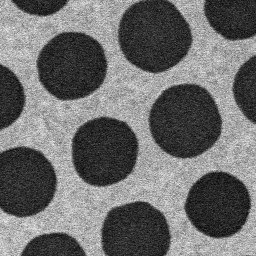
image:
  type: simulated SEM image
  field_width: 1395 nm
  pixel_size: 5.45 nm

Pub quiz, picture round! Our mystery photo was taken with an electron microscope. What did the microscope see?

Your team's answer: holes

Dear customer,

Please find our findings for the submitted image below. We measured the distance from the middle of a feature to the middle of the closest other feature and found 480 nm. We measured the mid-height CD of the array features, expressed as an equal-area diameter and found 378 nanometres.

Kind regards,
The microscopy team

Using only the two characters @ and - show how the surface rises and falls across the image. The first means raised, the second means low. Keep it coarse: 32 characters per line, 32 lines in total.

@@------@@@@@@@@@-----@@@-------
@@@----@@@@@@@@@------@@@@------
@@@@@@@@@@@@@@@--------@@@------
@@@@@@@@@@@@@@@---------@@@-----
@@@@@@@----@@@@---------@@@@----
@@@@@@------@@@---------@@@@@@@@
@@@@@--------@@---------@@@@@@@@
@@@@@--------@@@-------@@@@@@@@-
-@@@@--------@@@@----@@@@@@@@@--
--@@@--------@@@@@@@@@@@@@@@@---
---@@--------@@@@@@@@@@-@@@@@---
---@@@------@@@@@@@@------@@@---
---@@@@@-@@@@@@@@@@--------@@---
---@@@@@@@@@@@@@@@@--------@@@--
--@@@@@@@@@@@@@@@@@---------@@@-
-@@@@@@@@@------@@@---------@@@@
@@@@@@@@@--------@@---------@@@@
@@@@@@@@@--------@@--------@@@@@
@---@@@@@--------@@@------@@@@@@
------@@@--------@@@@----@@@@@@@
------@@@--------@@@@@@@@@@@@@@@
-------@@@------@@@@@@@@@@--@@@@
-------@@@-----@@@@@@@@@@-----@@
-------@@@@@@@@@@@@@@@@@-------@
-------@@@@@@@@@@@@@@@@--------@
------@@@@@@@@@@---@@@@--------@
@----@@@@@@@@@------@@@--------@
@@@@@@@@@@@@@--------@@@-------@
@@@@@@@@@@@@@--------@@@------@@
@@@@@----@@@@--------@@@@@---@@@
@@@-------@@@--------@@@@@@@@@@@
@@@--------@@--------@@@@@@@@@@@